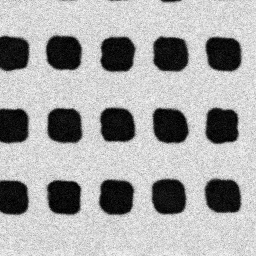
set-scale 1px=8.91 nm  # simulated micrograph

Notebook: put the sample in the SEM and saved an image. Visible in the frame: a regular array of holes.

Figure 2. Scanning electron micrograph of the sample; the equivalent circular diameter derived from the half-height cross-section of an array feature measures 0.323 um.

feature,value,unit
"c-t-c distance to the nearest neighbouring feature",469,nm